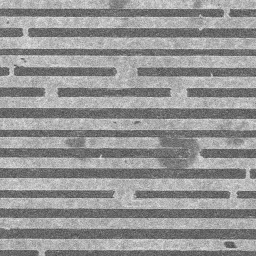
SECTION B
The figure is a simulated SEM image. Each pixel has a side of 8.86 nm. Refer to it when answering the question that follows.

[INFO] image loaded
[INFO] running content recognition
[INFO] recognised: parallel lines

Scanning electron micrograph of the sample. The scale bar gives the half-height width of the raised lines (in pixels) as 10.5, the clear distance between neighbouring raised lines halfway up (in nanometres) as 87.5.